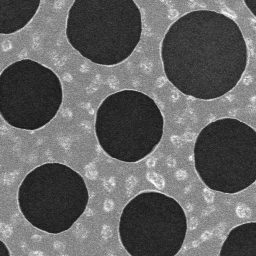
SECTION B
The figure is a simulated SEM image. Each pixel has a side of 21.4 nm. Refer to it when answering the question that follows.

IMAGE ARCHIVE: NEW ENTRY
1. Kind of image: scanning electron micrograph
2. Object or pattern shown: holes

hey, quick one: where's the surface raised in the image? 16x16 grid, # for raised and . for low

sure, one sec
..##.....#######
..##.....##....#
####.....#.....#
#####...##.....#
...#######.....#
....#######....#
....##....######
...###....####.#
######....##....
#######..###....
##..########....
#....########...
#....###...#####
##...###....####
###.###.....##..
########...###..